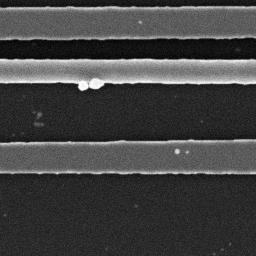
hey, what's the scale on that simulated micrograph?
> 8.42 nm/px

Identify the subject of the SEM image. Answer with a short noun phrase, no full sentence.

lines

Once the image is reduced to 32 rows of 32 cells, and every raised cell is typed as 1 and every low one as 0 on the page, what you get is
00000000000000000000000000000000
11111111111111111111111111111111
11111111111111111111111111111111
11111111111111111111111111111111
11111111111111111111111111111111
00000000000000000000000000000000
00000000000000000000000000000000
11111000001000011111101100000000
11111111111111111111111111111111
11111111111111111111111111111111
00000000001110000000000000000010
00000000000000000000000000000000
00000000000000000000000000000000
00000000000000000000000000000000
00000000000000000000000000000000
00000000000000000000000000000000
00000000000000000000000000000000
00000000000000000000000000000000
11111111111111111111111111111111
11111111111111111111111111111111
11111111111111111111111111111111
11111111111111111111111111111111
00000000000000000000000000000000
00000000000000000000000000000000
00000000000000000000000000000000
00000000000000000000000000000000
00000000000000000000000000000000
00000000000000000000000000000000
00000000000000000000000000000000
00000000000000000000000000000000
00000000000000000000000000000000
00000000000000000000000000000000